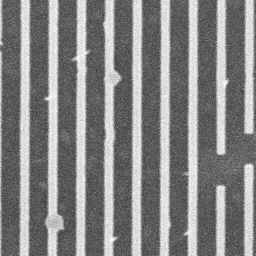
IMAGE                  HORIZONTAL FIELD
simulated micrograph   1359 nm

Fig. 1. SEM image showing parallel lines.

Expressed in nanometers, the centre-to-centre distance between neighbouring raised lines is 149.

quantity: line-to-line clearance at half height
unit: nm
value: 109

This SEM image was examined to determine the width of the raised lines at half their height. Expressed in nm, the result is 39.2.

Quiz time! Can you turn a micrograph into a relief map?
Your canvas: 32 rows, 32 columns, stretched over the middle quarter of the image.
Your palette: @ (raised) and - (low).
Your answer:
---@@-----@@-----@@-----@@------
----@-----@@-----@@-----@@------
---@@-----@@@----@@-----@@------
---@@-----@@@@---@@-----@@------
---@@-----@@@----@@-----@@------
---@@-----@@-----@@-----@@------
---@@-----@@-----@@-----@@------
---@@-----@@-----@@-----@@-----@
---@@-----@@-----@@-----@@-----@
---@@-----@@-----@@-----@@-----@
---@@-----@@-----@@-----@@-----@
---@@-----@@-----@@-----@@-----@
---@@-----@@-----@@-----@@-----@
---@@-----@@-----@@-----@@-----@
---@@-----@@-----@@-----@@-----@
---@@-----@@-----@@-----@@-----@
---@@-----@@-----@@-----@@-----@
---@@------@-----@@-----@@-----@
---@@------@-----@@-----@@-----@
---@@-----@@-----@@-----@@-----@
---@@-----@@-----@@-----@@-----@
---@@-----@@-----@@-----@@-----@
---@@-----@@-----@@-----@@-----@
---@@-----@@-----@@-----@@-----@
---@@-----@@-----@@-----@@-----@
---@@-----@@-----@@-----@@-----@
---@@-----@@-----@@-----@@-----@
---@@-----@@-----@@-----@@------
---@@-----@@-----@@-----@@-----@
---@@-----@@-----@@-----@@-----@
---@@-----@@-----@@-----@@-----@
---@@-----@@-----@@-----@@-----@